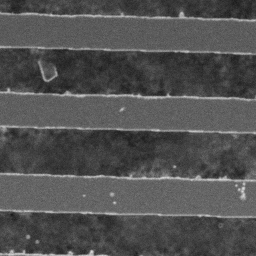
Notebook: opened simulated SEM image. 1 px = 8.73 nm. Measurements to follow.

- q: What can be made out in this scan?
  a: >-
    lines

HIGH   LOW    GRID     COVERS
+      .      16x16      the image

................
++++++++++++++++
++++++++++++++++
................
................
................
++++++++++++++++
++++++++++++++++
................
................
................
++++++++++++++++
++++++++++++++++
............++++
................
................